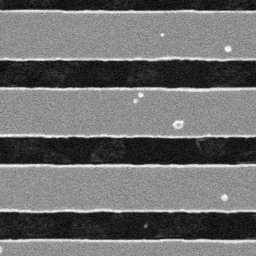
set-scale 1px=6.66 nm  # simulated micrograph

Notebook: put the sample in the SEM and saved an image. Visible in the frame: lines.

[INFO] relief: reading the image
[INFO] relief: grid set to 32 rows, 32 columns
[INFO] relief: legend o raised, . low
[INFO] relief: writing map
................................
oooooooooooooooooooooooooooooooo
oooooooooooooooooooooooooooooooo
oooooooooooooooooooooooooooooooo
oooooooooooooooooooooooooooooooo
oooooooooooooooooooooooooooooooo
oooooooooooooooooooooooooooooooo
.oooooooo.o.ooooo.oo.....ooooooo
................................
................................
................................
oooooooooooooooooooooooooooooooo
oooooooooooooooooooooooooooooooo
oooooooooooooooooooooooooooooooo
oooooooooooooooooooooooooooooooo
oooooooooooooooooooooooooooooooo
oooooooooooooooooooooooooooooooo
................................
................................
................................
................................
oooooooooooooooooooooooooooooooo
oooooooooooooooooooooooooooooooo
oooooooooooooooooooooooooooooooo
oooooooooooooooooooooooooooooooo
oooooooooooooooooooooooooooooooo
...ooo......................o...
................................
................................
................................
oooooooooooooooooooooooooooooooo
oooooooooooooooooooooooooooooooo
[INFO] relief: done